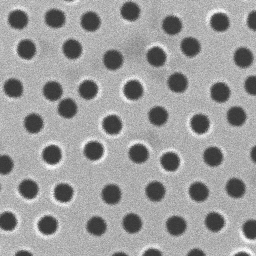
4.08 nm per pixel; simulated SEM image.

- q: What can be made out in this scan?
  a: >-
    a regular array of holes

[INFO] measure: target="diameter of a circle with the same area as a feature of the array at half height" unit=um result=0.0842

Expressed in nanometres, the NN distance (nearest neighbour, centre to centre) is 142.